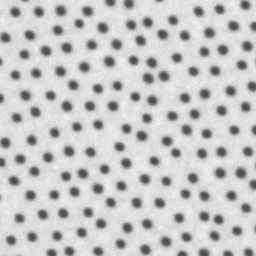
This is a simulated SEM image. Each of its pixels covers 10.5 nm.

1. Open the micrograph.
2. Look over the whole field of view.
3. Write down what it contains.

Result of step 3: a regular array of holes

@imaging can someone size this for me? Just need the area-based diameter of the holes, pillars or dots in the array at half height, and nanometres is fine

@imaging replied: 112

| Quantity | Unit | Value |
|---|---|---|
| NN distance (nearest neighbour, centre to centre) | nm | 205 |